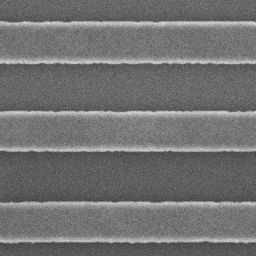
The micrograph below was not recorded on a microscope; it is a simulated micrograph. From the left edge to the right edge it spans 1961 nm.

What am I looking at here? lines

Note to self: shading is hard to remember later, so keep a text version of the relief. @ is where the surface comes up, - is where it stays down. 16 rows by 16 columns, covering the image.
----------------
@@@@@@@@@@@@@@@@
@@@@@@@@@@@@@@@@
@@@@@@@@@@@@@@@@
----------------
----------------
----------------
@@@@@@@@@@@@@@@@
@@@@@@@@@@@@@@@@
----------------
----------------
----------------
----------------
@@@@@@@@@@@@@@@@
@@@@@@@@@@@@@@@@
----------------